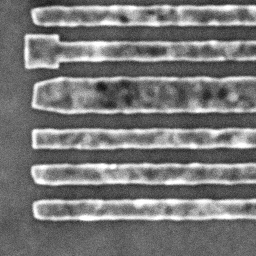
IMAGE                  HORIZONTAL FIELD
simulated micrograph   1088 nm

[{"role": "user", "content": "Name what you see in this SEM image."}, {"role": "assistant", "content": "wiring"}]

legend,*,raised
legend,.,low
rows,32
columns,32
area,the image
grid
................................
....****************************
....****************************
................................
....***.........................
...*****************************
...*****************************
...*************.****..*****.**.
......*.........................
................................
.....***************************
....****************************
....****************************
.....***************************
................................
................................
....****************************
....****************************
.......********.................
................................
........................*......*
....****************************
....****************************
................................
................................
....****************************
....****************************
................................
................................
................................
................................
................................